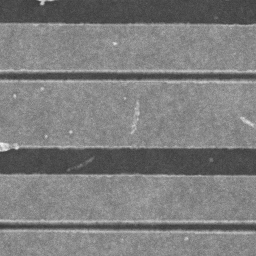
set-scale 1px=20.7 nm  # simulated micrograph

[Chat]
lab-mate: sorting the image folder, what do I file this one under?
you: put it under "lines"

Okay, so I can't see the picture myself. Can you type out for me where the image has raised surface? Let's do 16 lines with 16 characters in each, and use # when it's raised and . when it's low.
................
................
################
################
################
################
################
################
################
................
................
################
################
################
################
################